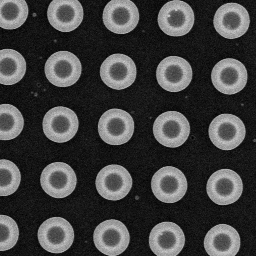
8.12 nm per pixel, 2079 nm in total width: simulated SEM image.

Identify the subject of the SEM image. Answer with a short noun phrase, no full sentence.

an array of small figures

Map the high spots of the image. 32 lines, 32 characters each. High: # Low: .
###...####...####....##.....##..
###...####...####...####...####.
###...####...####...####...####.
##.....##....####...####...####.
............................##..
................................
##.....##.......................
###...####...###....###.....##..
###...####...####...####...####.
###...####...####...####..#####.
##.....##....###....####...####.
............................##..
................................
##.....#........................
###...####...###....###....##...
###..#####..#####..#####..####..
###...####..#####..#####..#####.
......###....###....###...####..
...........................##...
................................
##....##........................
##...####...####....###....##...
###..#####..####...####...####..
##...####...####...####...####..
......##.....###...####...####..
...........................##...
................................
##....##......#.................
##...####...####...###.....##...
##...####...####...####...####..
##...####...####...####...####..
......##.....##....###....####..